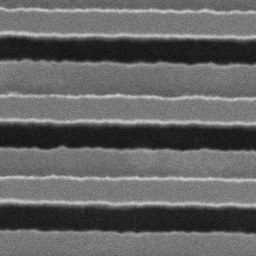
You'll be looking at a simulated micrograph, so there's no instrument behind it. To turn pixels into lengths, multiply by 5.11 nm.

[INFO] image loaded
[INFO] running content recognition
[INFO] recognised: lines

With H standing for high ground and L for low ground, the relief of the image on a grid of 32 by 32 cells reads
HHHHHHHHHHHHHHHHHHHHHHHHHHHHHHHH
HHHHHHHHHHHHHHHHHHHHHHHHHHHHHHHH
HHHHHHHHHHHHHHHHHHHHHHHHHHHHHHHH
HHHHHHHHHHHHHHHHHHHHHHHHHHHHHHHH
LLLLHHHHHHHLHHHLHHHHHHHHHHHHHHHH
LLLLLLLLLLLLLLLLLLLLLLLLLLLLLLLL
LLLLLLLLLLLLLLLLLLLLLLLLLLLLLLLL
LLLLLLLLLLLLLLLLLLLLLLLLLLLLLLLL
HHHHHHHHHHHHHHHHHHHHHHHHHHHHHHHH
HHHHHHHHHHHHHHHHHHHHHHHHHHHHHHHH
HHHHHHHHHHHHHHHHHHHHHHHHHHHHHHHH
HHHHHHHHHHHHHHHHHHHHHHHHHHHHHHHH
HHHHHHHHHHHHHHHHHHHHHHHHHHHHHHHH
HHHHHHHHHHHHHHHHHHHHHHHHHHHHHHHH
HHHHHHHHHHHHHHHHHHHHHHHHHHHHHHHH
LLLLLLLLLLLLLLLLLLLLLLLLLLHHHHHH
LLLLLLLLLLLLLLLLLLLLLLLLLLLLLLLL
LLLLLLLLLLLLLLLLLLLLLLLLLLLLLLLL
LLLLLLLHLLLLLLLLLLLLLLLLLLLLLLLL
HHHHHHHHHHHHHHHHHHHHHHHHHHHHHHHH
HHHHHHHHHHHHHHHHHHHHHHHHHHHHHHHH
HHHHHHHHHHHHHHHHHHHHHHHHHHHHHHHH
HHHHHHHHHHHHHHHHHHHHHHHHHHHHHHHH
HHHHHHHHHHHHHHHHHHHHHHHHHHHHHHHH
HHHHHHHHHHHHHHHHHHHHHHHHHHHHHHHH
LLLLLLLLLLLLLHHHLHLLHHHHHHHHHHHH
LLLLLLLLLLLLLLLLLLLLLLLLLLLLLLLL
LLLLLLLLLLLLLLLLLLLLLLLLLLLLLLLL
LLLLLLLLLLLLLLLLLLLLLLLLLLLLLLLL
HHHHHHHHHHHHHHHHHHHHHHHHHHHHHHHH
HHHHHHHHHHHHHHHHHHHHHHHHHHHHHHHH
HHHHHHHHHHHHHHHHHHHHHHHHHHHHHHHH